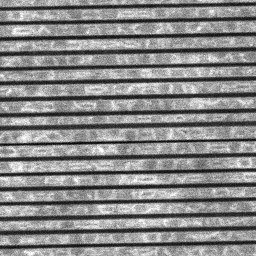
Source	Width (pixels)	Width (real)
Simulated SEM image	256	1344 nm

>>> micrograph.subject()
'parallel lines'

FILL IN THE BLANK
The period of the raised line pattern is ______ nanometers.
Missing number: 78.4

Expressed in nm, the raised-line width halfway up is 55.7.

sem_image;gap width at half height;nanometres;20.3